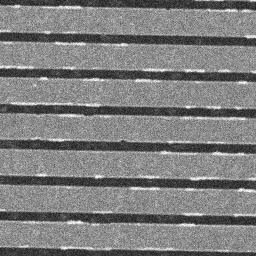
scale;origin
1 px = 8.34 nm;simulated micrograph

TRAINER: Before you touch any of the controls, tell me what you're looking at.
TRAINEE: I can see parallel lines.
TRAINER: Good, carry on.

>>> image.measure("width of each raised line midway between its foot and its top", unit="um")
0.221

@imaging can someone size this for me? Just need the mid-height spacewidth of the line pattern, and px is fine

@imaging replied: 9.75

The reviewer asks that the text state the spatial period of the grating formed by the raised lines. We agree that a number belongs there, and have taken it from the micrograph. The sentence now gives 299 nanometers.